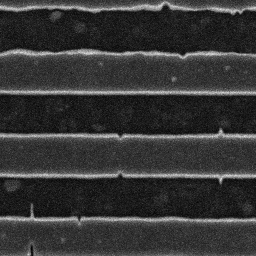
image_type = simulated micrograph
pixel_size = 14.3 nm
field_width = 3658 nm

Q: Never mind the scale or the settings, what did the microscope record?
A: one or a few lines or trenches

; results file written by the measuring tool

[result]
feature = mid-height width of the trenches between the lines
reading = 606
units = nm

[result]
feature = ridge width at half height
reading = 580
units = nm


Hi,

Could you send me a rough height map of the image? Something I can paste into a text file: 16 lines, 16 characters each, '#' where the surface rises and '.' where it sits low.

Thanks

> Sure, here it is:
##..######.#####
................
................
################
################
################
................
................
########...#####
################
################
................
................
................
################
################